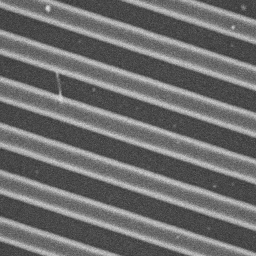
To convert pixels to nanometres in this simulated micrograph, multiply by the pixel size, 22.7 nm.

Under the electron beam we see lines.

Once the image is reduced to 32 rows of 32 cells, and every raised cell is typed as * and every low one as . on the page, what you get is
********.........********.......
..*********.........********....
.....*********.........********.
.........********.........******
**.........*********.........***
*****..........********.........
********..........********......
...********..........********...
......********..........********
.........********..........*****
**..........********..........**
******.........********.........
*********.........*********.....
...*********.........********...
......*********.........********
.........*********.........*****
***.........*********.........**
******.........*********........
.********..........********.....
....********..........********..
.......********..........*******
*.........*********.........****
***..........********..........*
*******.........********........
.*********.........*********....
....*********.........********..
........********.........*******
*..........********.........****
****..........********.........*
*******..........********.......
..********..........********....
.....********..........********.